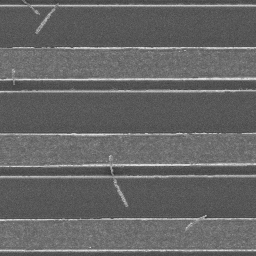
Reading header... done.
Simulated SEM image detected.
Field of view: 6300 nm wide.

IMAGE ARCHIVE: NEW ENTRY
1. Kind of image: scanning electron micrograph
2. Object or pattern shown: lines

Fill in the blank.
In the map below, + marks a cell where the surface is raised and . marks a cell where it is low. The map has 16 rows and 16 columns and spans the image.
................
................
................
++++++++++++++++
++++++++++++++++
................
................
................
++++++++++++++++
++++++++++++++++
................
................
................
................
++++++++++++++++
++++++++++++++++